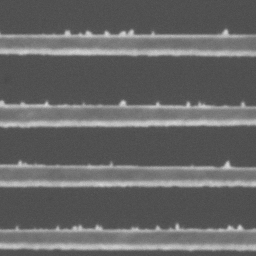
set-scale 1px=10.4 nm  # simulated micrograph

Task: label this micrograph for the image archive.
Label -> lines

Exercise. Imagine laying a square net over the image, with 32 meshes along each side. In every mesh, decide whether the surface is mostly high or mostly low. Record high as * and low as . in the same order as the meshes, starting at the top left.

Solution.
................................
................................
................................
................................
********************************
********************************
********************************
................................
................................
................................
................................
................................
................................
********************************
********************************
*****************************...
................................
................................
................................
................................
................................
********************************
********************************
................................
................................
................................
................................
................................
................................
********************************
********************************
................................